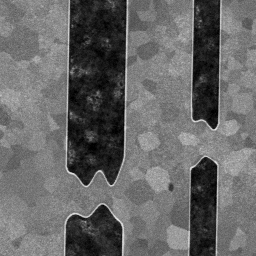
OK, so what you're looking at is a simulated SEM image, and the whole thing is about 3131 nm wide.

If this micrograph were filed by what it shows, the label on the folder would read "one or a few lines or trenches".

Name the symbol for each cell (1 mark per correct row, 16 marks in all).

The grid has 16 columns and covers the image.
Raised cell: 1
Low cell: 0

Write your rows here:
1111000011110011
1111000011110011
1111000011110011
1111000011110011
1111000011110011
1111000011110011
1111000011110011
1111000011110011
1111000011111111
1111000011111111
1111000011110011
1111111111110011
1111111111110011
1111100111110011
1111000011110011
1111000011110011